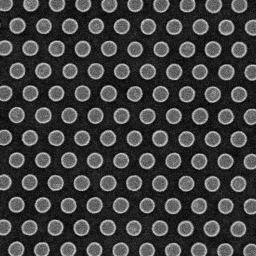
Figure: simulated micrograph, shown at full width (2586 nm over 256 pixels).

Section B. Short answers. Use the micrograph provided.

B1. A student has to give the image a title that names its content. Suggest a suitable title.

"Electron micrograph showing a regular array of raised bodies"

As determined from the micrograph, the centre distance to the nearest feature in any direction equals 257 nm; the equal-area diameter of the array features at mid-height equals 158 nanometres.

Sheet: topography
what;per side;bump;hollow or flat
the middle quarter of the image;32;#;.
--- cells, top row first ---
###...###....###....##.....##...
###...####...###...####...####..
###...####...###...####...####..
.#.....##.....#.....##....###...
................................
................................
...###....###...###....###...###
...###...####...###...####...###
...###...####...###....###...###
................................
................................
###....##....##.....##.....#....
###...####..####...####...###...
###...####..####...####...###...
##.....##....##.....##....###...
................................
................................
...###...####...###...###....###
...###...####...###...####...###
...###...####...###....###...###
................................
................................
##.....#......#.....##....###...
###...###....###...###....###...
###...####...###...###...####...
###...###....###...###....###...
................................
................................
...###...####...###....##....###
...###...####...###...####...###
...###...####...###...####...###
...##.....##...........##....###